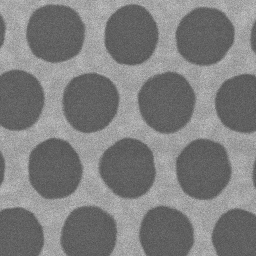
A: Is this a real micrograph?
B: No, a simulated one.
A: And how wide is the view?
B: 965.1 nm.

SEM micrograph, a regular array of holes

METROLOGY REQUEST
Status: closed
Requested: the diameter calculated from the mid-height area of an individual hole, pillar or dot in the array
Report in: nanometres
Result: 219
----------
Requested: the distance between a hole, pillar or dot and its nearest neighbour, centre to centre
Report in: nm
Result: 279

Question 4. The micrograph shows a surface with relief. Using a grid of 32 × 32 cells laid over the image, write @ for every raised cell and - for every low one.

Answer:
@@@@@@@@@@@@@@@@@@@@@@@@@@@@@@@@
@@@@-----@@@@@-----@@@@@----@@@@
@@@@------@@@------@@@@------@@@
-@@--------@@-------@@-------@@@
-@@--------@@-------@@-------@@-
@@@@------@@@-------@@-------@@-
@@@@------@@@@-----@@@------@@@@
@@@@@---@@@@@@----@@@@@-----@@@@
@@@@@@@@@@@@@@@@@@@@@@@@@@@@@@@@
----@@@@@@---@@@@@@----@@@@@@---
-----@@@@-----@@@@------@@@@----
-----@@@-------@@-------@@@-----
------@@-------@@-------@@@-----
-----@@@-------@@-------@@@-----
-----@@@------@@@@------@@@-----
----@@@@@-----@@@@-----@@@@@----
@@@@@@@@@@--@@@@@@@@--@@@@@@@@--
@@@@@@--@@@@@@@--@@@@@@@--@@@@@@
@@@@-----@@@@@-----@@@@-----@@@@
@@@@------@@@------@@@------@@@@
-@@@------@@@------@@@-------@@@
-@@@------@@-------@@@-------@@@
@@@@------@@@------@@@-------@@@
@@@@------@@@@-----@@@@-----@@@@
@@@@@---@@@@@@@---@@@@@@---@@@@@
@@@@@@@@@@@@@@@@@@@@@@@@@@@@@@@@
----@@@@@----@@@@@-----@@@@@---@
-----@@@------@@@@------@@@-----
-----@@@-------@@@------@@@-----
-----@@@-------@@-------@@@-----
-----@@@------@@@@------@@@-----
-----@@@------@@@@------@@@-----